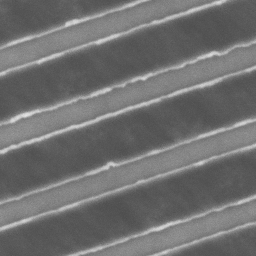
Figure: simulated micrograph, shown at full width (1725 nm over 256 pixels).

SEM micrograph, one or a few lines or trenches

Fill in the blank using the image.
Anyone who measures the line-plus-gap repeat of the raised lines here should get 0.498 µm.